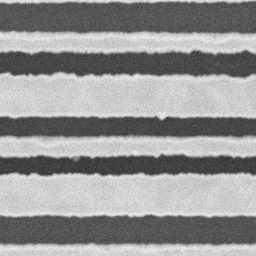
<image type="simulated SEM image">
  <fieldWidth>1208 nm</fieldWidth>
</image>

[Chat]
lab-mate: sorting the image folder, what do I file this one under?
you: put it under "lines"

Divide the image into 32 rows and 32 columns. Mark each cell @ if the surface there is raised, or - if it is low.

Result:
--------------------------------
--------------------------------
--------------------------------
--------------------------------
@@@@@@@@@@@@@@@@@@@@@@@@@@--@@-@
@@@@@@@@@@@@@@@@@@@@@@@@@@@@@@@@
---@@-----@@@@@----@------@@@@-@
--------------------------------
--------------------------------
@@@@@@@@@@@@@@@@@@@@@@@@-@@@---@
@@@@@@@@@@@@@@@@@@@@@@@@@@@@@@@@
@@@@@@@@@@@@@@@@@@@@@@@@@@@@@@@@
@@@@@@@@@@@@@@@@@@@@@@@@@@@@@@@@
@@@@@@@@@@@@@@@@@@@@@@@@@@@@@@@@
-@@@-@@@-@@@@@@@@@@@@@@@@-@@@@@@
--------------------------------
--------------------------------
@@@@@@@@@@@@@@@@@@@@@@@@@@@@@@@@
@@@@@@@@@@@@@@@@@@@@@@@@@@@@@@@@
@@@@@-@@@@-@@@@----@----@@---@@@
--------------------------------
--------------------------------
@@@@@@@@@@@@@@@@@@@@@@@@@@@@@@@@
@@@@@@@@@@@@@@@@@@@@@@@@@@@@@@@@
@@@@@@@@@@@@@@@@@@@@@@@@@@@@@@@@
@@@@@@@@@@@@@@@@@@@@@@@@@@@@@@@@
@@@@@@@@@@@@@@@@@@@@@@@@@@@@@@@@
--------------------------------
--------------------------------
--------------------------------
--------------------------------
@@@@@@@@@@@@@@@@@@@@@@@@@@@@@@@@